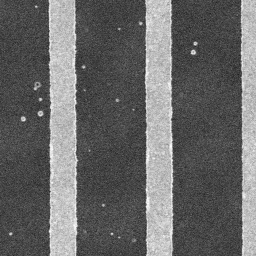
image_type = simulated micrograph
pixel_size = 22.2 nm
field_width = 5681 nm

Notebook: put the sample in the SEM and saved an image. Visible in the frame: one or a few lines or trenches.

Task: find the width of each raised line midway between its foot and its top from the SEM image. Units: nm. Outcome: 555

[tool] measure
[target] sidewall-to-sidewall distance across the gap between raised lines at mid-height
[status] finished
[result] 1.58 micrometres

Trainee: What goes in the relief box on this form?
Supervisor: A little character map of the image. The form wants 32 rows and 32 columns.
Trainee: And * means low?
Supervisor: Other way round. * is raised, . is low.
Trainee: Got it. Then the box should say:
......***.........***.........**
......***.........***.........**
......***.........***.........**
......***..........**.........**
......***.........***.........**
......***.........***.........**
......***.........***.........**
......***.........***.........**
......***.........***.........**
......***.........***.........**
......***.........***.........**
......***.........***.........**
......***.........***.........**
......***.........***.........**
......***.........***.........**
......***.........***.........**
......***.........***.........**
......***.........***.........**
......***.........***.........**
......***.........***.........**
......***.........***.........**
.......**.........***.........**
......***.........***.........**
......***.........***.........**
......***.........***.........**
......***.........****........**
......***.........****........**
......***.........****........**
......***.........****........**
......***.........***.........**
......***.........***.........**
......***.........***.........**